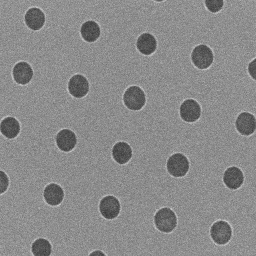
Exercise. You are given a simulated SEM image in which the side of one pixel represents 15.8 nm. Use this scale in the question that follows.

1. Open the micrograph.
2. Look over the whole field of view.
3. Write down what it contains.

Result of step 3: a regular array of holes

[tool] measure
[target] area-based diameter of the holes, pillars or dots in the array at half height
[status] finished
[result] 0.356 µm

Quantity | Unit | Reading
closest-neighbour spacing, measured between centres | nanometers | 878